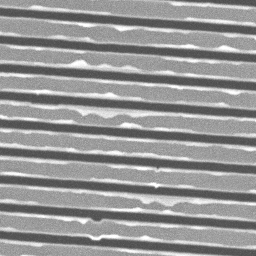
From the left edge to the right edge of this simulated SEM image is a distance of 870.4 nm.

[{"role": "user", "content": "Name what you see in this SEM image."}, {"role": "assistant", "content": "parallel lines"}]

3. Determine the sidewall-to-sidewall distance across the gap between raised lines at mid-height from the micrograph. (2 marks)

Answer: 31.3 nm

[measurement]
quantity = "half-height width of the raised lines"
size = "62.7 nanometers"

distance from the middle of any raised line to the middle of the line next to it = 94.6 nanometers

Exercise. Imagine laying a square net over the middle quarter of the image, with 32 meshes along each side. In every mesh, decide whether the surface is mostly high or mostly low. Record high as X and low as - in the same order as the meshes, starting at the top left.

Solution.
XXXXXXXXXXXXXXXXXXXXXXXXXXXXXXXX
---------XX-XXXXXXXXXXXXXXXXXXXX
----------------------XXXXXXXXXX
XX------------------------------
XXXXXXXXXXXXXXX-----------------
XXXXXXXXXXXXXXXXXXXXXXXXXXXXX---
XXXXXXXXXXXXXXXXXXXXXXXXXXXXXXXX
XXXXXXXXXXXXXXXXXXXXXXXXXXXXXXXX
---------XXXXXXXXXXXXXXXXXXXXXXX
-----------------------XXXXXXXXX
XX------------------------------
XXXXXXXXXXXXXXXX----------------
XXXXXXXXXXXXXXXXXXXXXXXXXXXXXX--
XXXXXXXXXXXXXXXXXXXXXXXXXXXXXXXX
XXXXXXXXXXXXXXXXXXXXXXXXXXXXXXXX
----------XXXXXXXXXXXXXXXXXXXXXX
------------------------XXXXXXXX
XXX-----------------------------
XXXXXXXXXXXXX--X----------------
XXXXXXXXXXXXXXXXXXXXXXXXXXXXXX--
XXXXXXXXXXXXXXXXXXXXXXXXXXXXXXXX
XXXXXXXXXXXXXXXXXXXXXXXXXXXXXXXX
-----------XXXXXXXXXXXXXXXXXXXXX
------------------------XXXXXXXX
XXXX----------------------------
XXXXXXXXXXXXXXXXX---------------
XXXXXXXXXXXXXXXXXXXXXXXXXXXX----
XXXXXXXXXXXXXXXXXXXXXXXXXXXXXXXX
XXXXXXXXXXXXXXXXXXXXXXXXXXXXXXXX
-----------XXXXXXXXXXXXXXXXXXXXX
----------------------XX-XXXXXXX
XXXX----------------------------